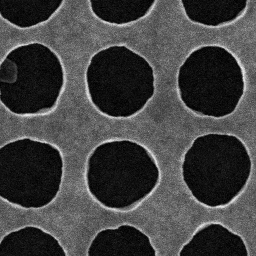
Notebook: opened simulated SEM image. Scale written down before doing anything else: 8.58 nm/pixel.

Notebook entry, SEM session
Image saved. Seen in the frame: holes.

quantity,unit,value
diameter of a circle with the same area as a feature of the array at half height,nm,598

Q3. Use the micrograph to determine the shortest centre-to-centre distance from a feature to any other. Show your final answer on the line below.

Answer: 88.9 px